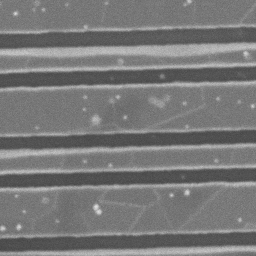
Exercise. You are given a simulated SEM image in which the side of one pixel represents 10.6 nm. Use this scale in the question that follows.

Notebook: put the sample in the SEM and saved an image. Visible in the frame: lines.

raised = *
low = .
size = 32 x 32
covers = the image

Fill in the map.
********************************
********************************
********************************
**********************..........
................................
................................
********************************
********************************
*******************.............
................................
....................************
********************************
********************************
********************************
********************************
********************************
*******************.............
................................
..................**************
********************************
********************************
******..........................
................................
.....***************************
********************************
********************************
********************************
********************************
********************************
*******..*......................
................................
..............******************